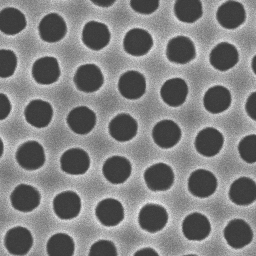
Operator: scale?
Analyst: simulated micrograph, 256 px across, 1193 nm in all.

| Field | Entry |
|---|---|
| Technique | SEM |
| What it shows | a regular array of holes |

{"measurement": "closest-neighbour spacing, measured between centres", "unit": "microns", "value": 0.198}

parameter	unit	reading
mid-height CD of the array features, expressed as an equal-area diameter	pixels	28